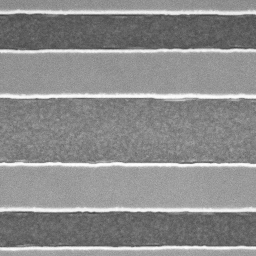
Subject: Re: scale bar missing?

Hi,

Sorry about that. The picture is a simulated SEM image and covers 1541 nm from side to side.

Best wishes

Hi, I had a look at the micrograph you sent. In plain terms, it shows lines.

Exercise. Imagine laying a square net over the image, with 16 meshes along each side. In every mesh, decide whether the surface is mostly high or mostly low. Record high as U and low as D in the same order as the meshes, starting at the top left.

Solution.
UUUUUUUUUUUUUUUU
DDDDDDDDDDDDDDDD
DDDDDDDDDDDDDDDD
UUUUUUUUUUUUUUUU
UUUUUUUUUUUUUUUU
UUUUUUUUUUUUUUUU
DDDDDDDDDDDDDDDD
DDDDDDDDDDDDDDDD
DDDDDDDDDDDDDDDD
DDDDDDDDDDDDDDDD
UUUUUUUUUUUUUUUU
UUUUUUUUUUUUUUUU
UUUUUUUUUUUUUUUU
DDDDDDDDDDDDDDDD
DDDDDDDDDDDDDDDD
UUUUUUUUUUUUUUUU